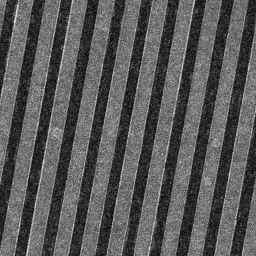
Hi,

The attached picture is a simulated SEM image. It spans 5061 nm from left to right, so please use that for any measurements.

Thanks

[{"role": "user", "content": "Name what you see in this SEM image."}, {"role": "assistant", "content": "parallel lines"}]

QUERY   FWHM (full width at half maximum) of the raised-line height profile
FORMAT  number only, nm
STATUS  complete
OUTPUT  282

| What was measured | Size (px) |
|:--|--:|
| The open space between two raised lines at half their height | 11.9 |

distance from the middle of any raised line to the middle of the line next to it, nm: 523